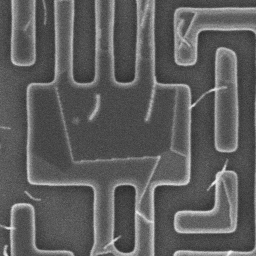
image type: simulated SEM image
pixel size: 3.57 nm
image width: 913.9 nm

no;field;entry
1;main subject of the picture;wiring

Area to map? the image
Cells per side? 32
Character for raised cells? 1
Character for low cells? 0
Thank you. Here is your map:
00110001100011000110000000000000
00110001100011000110001111111111
00110001100011000110001111111111
00110001100011000110001111111111
01110001100011000110001110000000
01110001100011000110001110000000
01110001100011000110001110011000
00110001100011000110001110011000
00000001100011000110000000011000
00000001100011000110000000011000
00000011110111111111000000011100
00011111111111111111111100011100
00011111111111111111111100011100
00011111111111111111111100011100
00001111111111111111111100011100
00001111111111111111111100011100
00001111111111111111111100011100
00001111111111111111111100011100
00011111111111111111111100011000
00011111111111111111111100000000
00011111111111111111111100000000
00011111111111111111111100001000
00001111111111111111111100011100
00000000000011000110000000011100
00000000000011000110000000011100
00100000000011000110000000011100
01110000000011000110001100111100
01110000000011000110001111111100
01110000000011000110001111111000
01110000000011000110000000000000
01110000000011000110000000000000
01111111100111101110001111111101